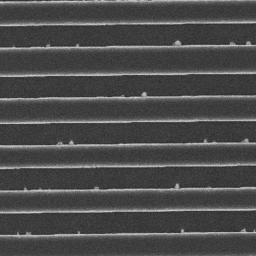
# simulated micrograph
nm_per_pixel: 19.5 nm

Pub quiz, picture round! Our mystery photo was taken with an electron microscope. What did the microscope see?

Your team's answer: lines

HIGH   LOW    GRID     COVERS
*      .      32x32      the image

********************************
********************************
********************************
................................
................................
................................
********************************
********************************
********************************
***.............................
................................
................................
********************************
********************************
********************************
................................
................................
................................
********************************
********************************
********************************
................................
................................
................................
********************************
********************************
**..............................
................................
................................
********************************
********************************
********************************